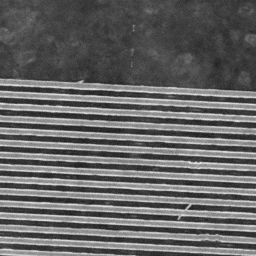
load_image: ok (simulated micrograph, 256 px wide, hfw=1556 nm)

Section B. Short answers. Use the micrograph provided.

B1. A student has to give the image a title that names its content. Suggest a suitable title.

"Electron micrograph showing parallel lines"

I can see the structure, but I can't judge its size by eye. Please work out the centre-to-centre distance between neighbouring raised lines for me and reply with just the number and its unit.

0.0738 um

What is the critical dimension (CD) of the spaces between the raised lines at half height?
41 nm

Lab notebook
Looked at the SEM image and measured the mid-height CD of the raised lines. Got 31.1 nm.